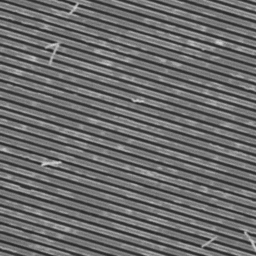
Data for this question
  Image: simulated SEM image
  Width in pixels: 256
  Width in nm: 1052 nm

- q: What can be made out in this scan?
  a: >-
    parallel lines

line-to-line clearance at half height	15.8	nanometers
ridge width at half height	19.7	nm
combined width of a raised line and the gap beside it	35.2	nanometers